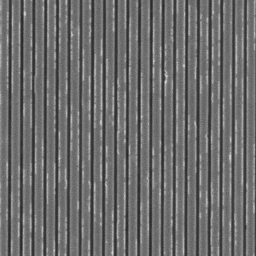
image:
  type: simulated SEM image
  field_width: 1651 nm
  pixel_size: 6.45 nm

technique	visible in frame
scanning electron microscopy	parallel lines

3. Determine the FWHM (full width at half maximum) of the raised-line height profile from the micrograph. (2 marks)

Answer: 53.2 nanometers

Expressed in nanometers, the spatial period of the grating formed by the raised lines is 75.8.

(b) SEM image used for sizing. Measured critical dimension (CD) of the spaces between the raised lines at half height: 17.7 nm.